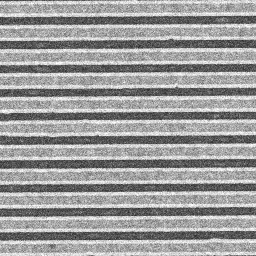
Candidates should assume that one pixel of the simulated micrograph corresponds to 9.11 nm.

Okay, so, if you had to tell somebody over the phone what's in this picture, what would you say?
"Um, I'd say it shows parallel lines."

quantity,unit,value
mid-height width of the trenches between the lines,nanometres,107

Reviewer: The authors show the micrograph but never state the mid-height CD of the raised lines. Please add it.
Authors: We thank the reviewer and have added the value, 116 nm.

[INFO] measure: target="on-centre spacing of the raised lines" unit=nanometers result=218